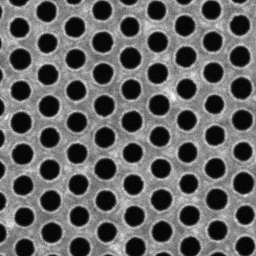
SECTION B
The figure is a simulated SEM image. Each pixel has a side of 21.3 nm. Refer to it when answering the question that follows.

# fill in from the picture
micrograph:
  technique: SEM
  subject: a regular array of raised bodies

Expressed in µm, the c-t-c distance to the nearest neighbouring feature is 0.665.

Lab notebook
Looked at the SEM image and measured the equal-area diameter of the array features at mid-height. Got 0.508 um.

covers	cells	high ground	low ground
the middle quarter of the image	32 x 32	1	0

01111000111100111110011111001111
00110001111110001000011111000000
00000001111110000000011111000000
00000001111100001100011111000011
01111000111100011110011111001111
11111100000000111111000000001111
11111100000000111111000000001111
11111100000000111111000110001111
01111000111100011110011111000111
00110001111110000000011111100000
00000001111110000000011111100000
00000001111110000100011111100011
01111000111100011110001111001111
01111100000000111111000000001111
11111100000000111111000000001111
11111100011000111111000110001111
01111000111110011110001111000111
00000001111110000000011111100000
00000001111110000000011111100000
00010001111110000100011111100011
01111100111100011110001111000111
01111100000000011111000000001111
11111100000000111111000000001111
01111100011100011111000110001111
01111000111110011110001111100111
00000001111110000000011111100000
00000001111110000000011111100000
00111001111110001110001111100011
01111100111100011111000111000111
01111100000000011111000000000111
01111100000000011111000000000111
01111100011100011111000111000111